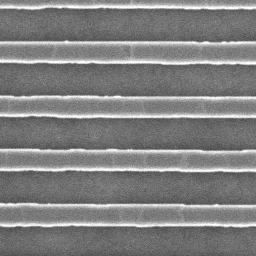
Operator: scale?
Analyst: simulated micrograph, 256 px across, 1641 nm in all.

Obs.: lines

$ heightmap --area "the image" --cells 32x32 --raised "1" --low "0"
11111111111111111111111111111111
00000000000000000000000000000000
00000000000000000000000000000000
00000000000000000000000000000000
00000000000000000000000000000000
11111111111111111111111111111111
11111111111111111111111111111111
11111111111111111111111111111111
00000000000000000000000000000000
00000000000000000000000000000000
00000000000000000000000000000000
00000000000000000000000000000000
11111111111111111111111111111111
11111111111111111111111111111111
01100011111111111111111111111111
00000000000000000000000000000000
00000000000000000000000000000000
00000000000000000000000000000000
00000000000000000000000000000000
11111111111111111111111111111111
11111111111111111111111111111111
00000000000000000000000000000000
00000000000000000000000000000000
00000000000000000000000000000000
00000000000000000000000000000000
11111010000000000000000000000000
11111111111111111111111111111111
11111111111111111111111111111111
00000000000000000000000000000000
00000000000000000000000000000000
00000000000000000000000000000000
00000000000000000000000000000000